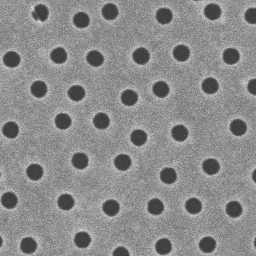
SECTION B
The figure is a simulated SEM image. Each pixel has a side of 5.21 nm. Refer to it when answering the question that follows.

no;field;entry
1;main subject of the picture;a regular array of holes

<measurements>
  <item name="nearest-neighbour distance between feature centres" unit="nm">206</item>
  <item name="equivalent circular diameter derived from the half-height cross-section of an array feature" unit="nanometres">87.3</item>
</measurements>